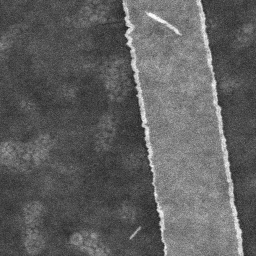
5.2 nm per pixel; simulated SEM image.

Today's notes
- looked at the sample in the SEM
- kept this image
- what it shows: one or a few lines or trenches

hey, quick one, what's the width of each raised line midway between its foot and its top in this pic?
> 402 nm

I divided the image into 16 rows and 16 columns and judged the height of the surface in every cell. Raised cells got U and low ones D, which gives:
DDDDDDDDUUUUUDDD
DDDDDDDDUUUUUDDD
DDDDDDDDUUUUUDDD
DDDDDDDDUUUUUDDD
DDDDDDDDUUUUUDDD
DDDDDDDDDUUUUDDD
DDDDDDDDDUUUUUDD
DDDDDDDDDUUUUUDD
DDDDDDDDDUUUUUDD
DDDDDDDDDUUUUUDD
DDDDDDDDDUUUUUDD
DDDDDDDDDDUUUUUD
DDDDDDDDDDUUUUUD
DDDDDDDDDDUUUUUD
DDDDDDDDDDUUUUUD
DDDDDDDDDDUUUUUD